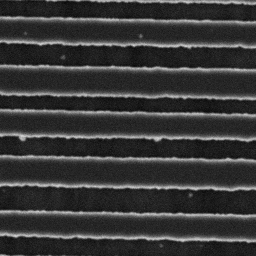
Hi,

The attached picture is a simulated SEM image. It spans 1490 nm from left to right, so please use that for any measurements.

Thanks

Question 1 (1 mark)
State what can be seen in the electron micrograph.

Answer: lines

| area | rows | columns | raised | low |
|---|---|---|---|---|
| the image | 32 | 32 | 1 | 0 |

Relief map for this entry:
00000000000000000000000000000001
00000000000000000000000000000000
11111111111111111111000100000000
11111111111111111111111111111111
11111111111111111111111111111111
00001100111111111111111111111111
00000000000000000000000000000000
00000000000000000000000000000000
11111111111111111011000000000000
11111111111111111111111111111111
11111111111111111111111111111111
11111111111111111111111111111111
00000000000000000000000000000000
00000000000000000000000000000000
11111111111111111111111111111111
11111111111111111111111111111111
11111111111111111111111111111111
00000000000000000000000000000011
00000000000000000000000000000000
11010000000000000000000000000000
11111111111111111111111111111111
11111111111111111111111111111111
11111111111111111111111111111111
00000000000000000011101111111111
00000000000000000000000000000000
00000000000000000000000000000000
11111111101011000000000000000000
11111111111111111111111111111111
11111111111111111111111111111111
01111111111111111111111111111111
00000000000000000000000000000000
00000000000000000000000000000000